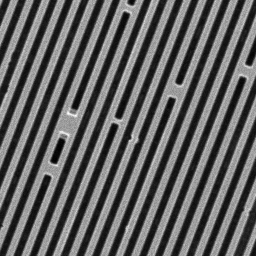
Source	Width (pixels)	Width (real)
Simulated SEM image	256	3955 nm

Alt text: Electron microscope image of parallel lines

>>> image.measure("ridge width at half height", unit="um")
0.117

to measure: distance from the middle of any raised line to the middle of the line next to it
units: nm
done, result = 226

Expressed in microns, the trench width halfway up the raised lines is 0.115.